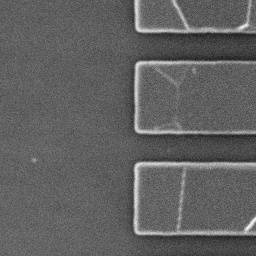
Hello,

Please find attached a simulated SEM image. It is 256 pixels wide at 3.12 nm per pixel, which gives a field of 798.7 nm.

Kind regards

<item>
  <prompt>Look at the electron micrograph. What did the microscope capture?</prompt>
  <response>wiring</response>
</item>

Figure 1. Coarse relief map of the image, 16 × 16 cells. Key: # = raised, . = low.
........########
.........#######
................
................
........########
........########
........########
........########
................
................
.........#######
........########
........########
........########
.........#######
................